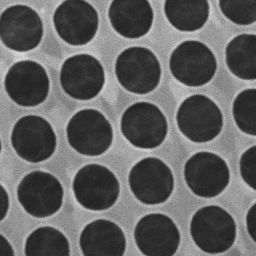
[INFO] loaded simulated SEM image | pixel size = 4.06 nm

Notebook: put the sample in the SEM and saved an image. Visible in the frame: a regular array of holes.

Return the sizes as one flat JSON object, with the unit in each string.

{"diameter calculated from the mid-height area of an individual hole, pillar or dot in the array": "188 nanometres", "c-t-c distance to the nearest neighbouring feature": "225 nm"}